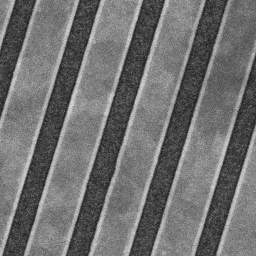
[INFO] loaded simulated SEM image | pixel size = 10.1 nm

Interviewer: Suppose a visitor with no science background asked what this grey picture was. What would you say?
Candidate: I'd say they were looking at one or a few lines or trenches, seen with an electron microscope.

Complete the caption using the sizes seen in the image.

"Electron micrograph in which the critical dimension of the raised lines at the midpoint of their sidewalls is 38.1 px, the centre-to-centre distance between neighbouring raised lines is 0.617 µm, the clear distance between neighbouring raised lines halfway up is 234 nanometers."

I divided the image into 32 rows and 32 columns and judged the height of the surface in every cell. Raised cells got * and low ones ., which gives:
**...*****...*****...****....***
*...*****...*****...*****...****
*...*****...*****...*****...****
*...*****...*****...****....****
...*****...*****...*****...*****
...*****...*****...*****...*****
...*****...*****...*****...*****
..*****....****....****...*****.
..*****...*****...*****...*****.
..*****...*****...*****...*****.
..*****...*****...****...******.
.*****...*****...*****...*****..
.*****...*****...*****...*****..
.*****...*****...*****...*****..
*****...*****....****...*****...
*****...*****...*****...*****...
*****...*****...*****...*****...
****....****....****...******..*
****...*****...*****...*****...*
****...*****...*****...*****...*
****...****....****...******...*
***...*****...*****...*****...**
***...*****...*****...*****...**
***...*****...****....*****...**
**...*****...*****...*****...***
**...*****...*****...*****...***
**...*****...*****...*****...***
*...*****....****...*****...****
*...*****...*****...*****...****
*...*****...*****...*****...****
*...*****...****...******...****
...*****...*****...*****...*****